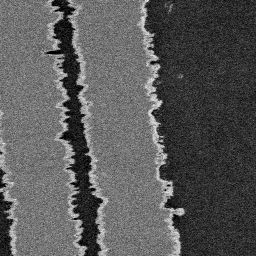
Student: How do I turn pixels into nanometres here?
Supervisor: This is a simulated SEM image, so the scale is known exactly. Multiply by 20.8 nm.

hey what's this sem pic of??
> one or a few lines or trenches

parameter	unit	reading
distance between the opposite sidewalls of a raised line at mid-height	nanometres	1460